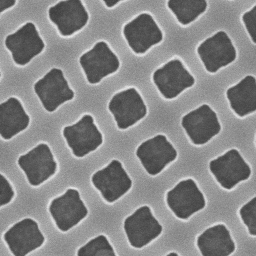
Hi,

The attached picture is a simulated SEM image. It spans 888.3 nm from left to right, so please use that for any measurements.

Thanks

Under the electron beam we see a regular array of holes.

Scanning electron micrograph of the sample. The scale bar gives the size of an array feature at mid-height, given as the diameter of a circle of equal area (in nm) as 129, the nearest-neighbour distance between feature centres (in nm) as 182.